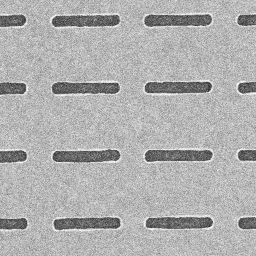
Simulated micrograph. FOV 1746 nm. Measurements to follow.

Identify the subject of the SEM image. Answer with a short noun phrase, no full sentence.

a regular array of holes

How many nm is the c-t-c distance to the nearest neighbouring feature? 460